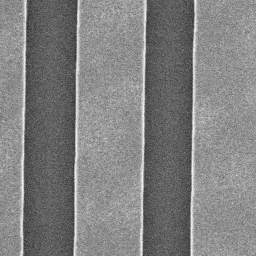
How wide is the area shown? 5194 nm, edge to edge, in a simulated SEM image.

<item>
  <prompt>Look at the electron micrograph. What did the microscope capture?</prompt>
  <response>wiring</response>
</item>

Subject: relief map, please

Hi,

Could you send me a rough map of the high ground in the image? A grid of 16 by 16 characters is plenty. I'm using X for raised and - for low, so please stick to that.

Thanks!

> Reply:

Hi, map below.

XX---XXXX---XXXX
XX---XXXX---XXXX
XX---XXXX---XXXX
XX---XXXX---XXXX
XX---XXXX---XXXX
XX---XXXX---XXXX
XX---XXXX---XXXX
X----XXXX---XXXX
X----XXXX---XXXX
X----XXXX---XXXX
X----XXXX---XXXX
X----XXXX---XXXX
X----XXXX---XXXX
X----XXXX---XXXX
X----XXXX---XXXX
X----XXXX---XXXX